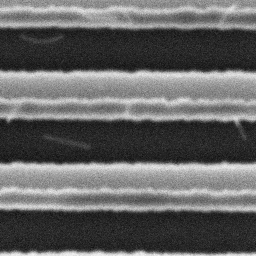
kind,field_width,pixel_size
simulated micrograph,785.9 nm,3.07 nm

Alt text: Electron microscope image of lines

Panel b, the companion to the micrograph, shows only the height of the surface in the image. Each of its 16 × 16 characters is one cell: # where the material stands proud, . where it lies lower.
################
################
................
................
................
################
################
................
................
................
################
################
################
................
................
................